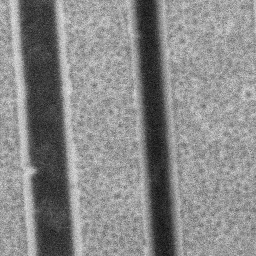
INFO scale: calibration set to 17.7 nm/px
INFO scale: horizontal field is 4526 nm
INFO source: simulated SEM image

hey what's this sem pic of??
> one or a few lines or trenches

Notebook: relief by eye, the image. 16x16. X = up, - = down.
X---XXXX--XXXXXX
X---XXXX--XXXXXX
X---XXXX--XXXXXX
X---XXXX--XXXXXX
X---XXXX--XXXXXX
X---XXXXX-XXXXXX
X---XXXXX--XXXXX
X---XXXXX--XXXXX
X---XXXXX--XXXXX
XX--XXXXX--XXXXX
XX---XXXX--XXXXX
XX---XXXX--XXXXX
XX---XXXX--XXXXX
XX---XXXX--XXXXX
XX---XXXX--XXXXX
XX---XXXX--XXXXX